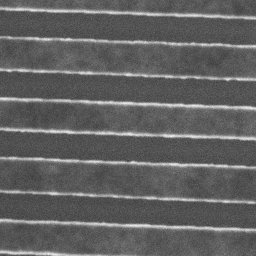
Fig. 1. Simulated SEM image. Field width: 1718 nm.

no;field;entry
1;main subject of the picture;lines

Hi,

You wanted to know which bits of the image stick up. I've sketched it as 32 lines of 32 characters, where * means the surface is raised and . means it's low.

********************************
...........*********************
................................
................................
................................
*************************.......
********************************
********************************
********************************
..................**************
................................
................................
*****...........................
********************************
********************************
********************************
......**************************
................................
................................
................................
***********************.........
********************************
********************************
********************************
...........*********************
................................
................................
*...............................
**************************......
********************************
********************************
********************************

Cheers